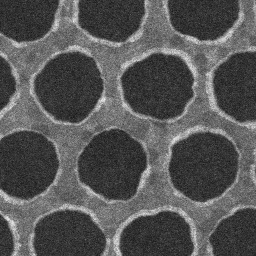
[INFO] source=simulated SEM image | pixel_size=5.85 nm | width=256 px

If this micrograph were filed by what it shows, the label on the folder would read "holes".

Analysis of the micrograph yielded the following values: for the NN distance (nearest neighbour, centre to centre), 523 nanometres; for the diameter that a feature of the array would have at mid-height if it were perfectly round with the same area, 70.9 px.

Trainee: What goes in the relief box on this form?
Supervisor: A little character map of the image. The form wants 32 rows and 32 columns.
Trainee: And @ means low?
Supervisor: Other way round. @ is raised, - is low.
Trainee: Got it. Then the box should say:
-------@@@--------@@@---------@@
-------@@@--------@@@---------@@
-------@@@--------@@@---------@@
-------@@@-------@@@@@-------@@@
------@@@@@------@@@@@@@----@@@@
@@@@@@@@@@@@@@@@@@@@@@@@@@@@@@@@
@@@@@@@@--@@@@@@@@@-@@@@@@@@@@--
-@@@@@------@@@@@------@@@@@----
--@@@-------@@@@--------@@@-----
--@@---------@@---------@@------
--@@---------@@---------@@------
--@@---------@@---------@@@-----
-@@@@-------@@@---------@@@-----
-@@@@-------@@@@-------@@@@-----
@@@@@@-----@@@@@@@----@@@@@@----
@@@@@@@@@@@@@@@@@@@@@@@@@@@@@@@@
@----@@@@@@@@---@@@@@@@@---@@@@@
------@@@@@------@@@@@-------@@@
-------@@@@-------@@@---------@@
-------@@@--------@@@---------@@
-------@@@--------@@@---------@@
-------@@@--------@@@---------@@
-------@@@--------@@@---------@@
------@@@@@------@@@@@-------@@@
@----@@@@@@@-----@@@@@@-----@@@@
@@@@@@@@@@@@@@@@@@@@@@@@@@@@@@@@
@@@@@@@----@@@@@@@@@--@@@@@@@---
-@@@@-------@@@@@------@@@@@----
-@@@---------@@@--------@@@-----
--@@---------@@---------@@------
--@@---------@@---------@@------
--@@---------@@---------@@------